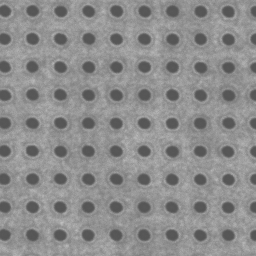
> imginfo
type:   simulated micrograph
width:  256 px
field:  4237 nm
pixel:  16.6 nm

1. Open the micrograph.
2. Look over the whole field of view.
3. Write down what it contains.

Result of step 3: a regular array of holes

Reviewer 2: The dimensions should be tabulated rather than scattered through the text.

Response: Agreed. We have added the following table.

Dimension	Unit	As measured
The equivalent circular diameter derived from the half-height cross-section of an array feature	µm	0.21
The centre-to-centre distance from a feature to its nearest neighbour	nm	457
